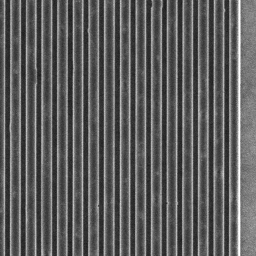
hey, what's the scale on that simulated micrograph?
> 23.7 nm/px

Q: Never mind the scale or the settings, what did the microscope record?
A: parallel lines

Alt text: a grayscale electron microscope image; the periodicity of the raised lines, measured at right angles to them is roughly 371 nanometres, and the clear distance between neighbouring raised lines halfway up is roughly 142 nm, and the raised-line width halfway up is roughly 225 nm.